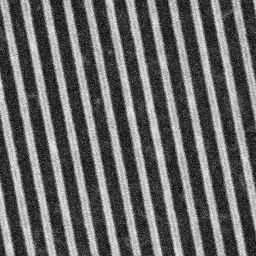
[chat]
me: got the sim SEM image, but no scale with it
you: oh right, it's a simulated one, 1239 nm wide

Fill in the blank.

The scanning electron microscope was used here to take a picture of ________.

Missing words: parallel lines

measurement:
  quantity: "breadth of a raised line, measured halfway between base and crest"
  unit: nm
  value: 29.2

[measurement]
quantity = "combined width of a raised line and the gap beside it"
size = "100 nanometers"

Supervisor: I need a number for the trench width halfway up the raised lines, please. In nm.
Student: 70.2